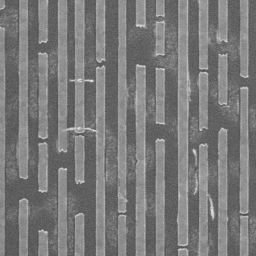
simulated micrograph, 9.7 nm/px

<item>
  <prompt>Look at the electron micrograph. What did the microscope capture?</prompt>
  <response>parallel lines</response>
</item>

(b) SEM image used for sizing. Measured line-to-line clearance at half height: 11.8 px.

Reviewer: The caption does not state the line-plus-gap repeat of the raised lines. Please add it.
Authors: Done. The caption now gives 20 pixels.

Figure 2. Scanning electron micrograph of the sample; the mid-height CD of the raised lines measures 81.2 nanometres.